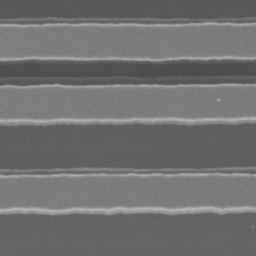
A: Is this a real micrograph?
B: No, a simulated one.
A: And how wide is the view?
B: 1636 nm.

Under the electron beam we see lines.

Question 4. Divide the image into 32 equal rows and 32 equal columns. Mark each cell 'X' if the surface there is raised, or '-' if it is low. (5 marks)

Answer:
--------------------------------
--------------------------------
--------------------------------
XXXXXXXXXXXXXXXXXXXXXXXXXXXXXXXX
XXXXXXXXXXXXXXXXXXXXXXXXXXXXXXXX
XXXXXXXXXXXXXXXXXXXXXXXXXXXXXXXX
XXXXXXXXXXXXXXXXXXXXXXXXXXXXXXXX
XXX------XXX---XXXXXX-----------
--------------------------------
--------------------------------
--------------------------------
XXXXXXXXXXXXXXXXXXXXXXXXXXXXXXXX
XXXXXXXXXXXXXXXXXXXXXXXXXXXXXXXX
XXXXXXXXXXXXXXXXXXXXXXXXXXXXXXXX
XXXXXXXXXXXXXXXXXXXXXXXXXXXXXXXX
--------------------------------
--------------------------------
--------------------------------
--------------------------------
--------------------------------
--------------------------------
--------------------------------
XXXXXXXXXXXXXXXXXXXXXXXXXXXXXXXX
XXXXXXXXXXXXXXXXXXXXXXXXXXXXXXXX
XXXXXXXXXXXXXXXXXXXXXXXXXXXXXXXX
XXXXXXXXXXXXXXXXXXXXXXXXXXXXXXXX
--------------------------------
--------------------------------
--------------------------------
--------------------------------
--------------------------------
--------------------------------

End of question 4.